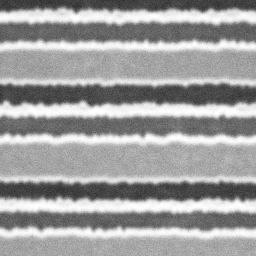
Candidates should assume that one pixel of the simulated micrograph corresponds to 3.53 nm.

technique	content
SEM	lines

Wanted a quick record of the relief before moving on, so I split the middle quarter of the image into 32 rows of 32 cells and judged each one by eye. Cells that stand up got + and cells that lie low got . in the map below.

++++++++++++++++++++++++++++++++
++++++++++++++++++++++++++++++++
++++++++++++++++++++++++++++++++
++++++++++++++++++++++++++++++++
+++.++++.+++++++++++++++++++++++
................................
................................
................................
................................
................................
++++++....+......++++++..+++++.+
++++++++++++++++++++++++++++++++
++.+++++.+.+++++++.+.++++++++.++
................................
................................
................................
................................
................................
+++++....+.+...+..+.+++...+++++.
++++++++++++++++++++++++++++++++
++++++++++++++++++++++++++++++++
++++++++++++++++++++++++++++++++
++++++++++++++++++++++++++++++++
++++++++++++++++++++++++++++++++
++++++++++++++++++++++++++++++++
++++++++++++++++++++++++++++++++
++++++++++++++++++++++++++++++++
++++++++++++++++++++++++++++++++
++++++++++++++++++++++++++++++++
...........+....+...............
................................
................................